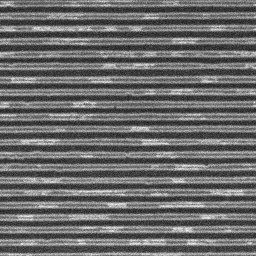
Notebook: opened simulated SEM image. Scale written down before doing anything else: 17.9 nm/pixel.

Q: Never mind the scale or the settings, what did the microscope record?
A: parallel lines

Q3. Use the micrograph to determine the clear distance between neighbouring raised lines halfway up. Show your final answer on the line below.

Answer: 7.75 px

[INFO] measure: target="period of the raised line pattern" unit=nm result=226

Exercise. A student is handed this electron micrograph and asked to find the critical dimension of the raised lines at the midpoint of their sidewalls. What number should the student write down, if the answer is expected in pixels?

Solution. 4.88